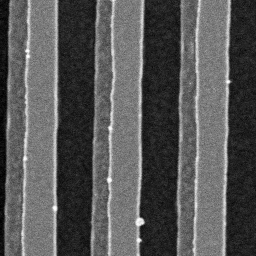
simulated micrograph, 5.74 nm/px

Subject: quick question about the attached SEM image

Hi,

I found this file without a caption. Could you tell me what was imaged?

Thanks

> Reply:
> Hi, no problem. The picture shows lines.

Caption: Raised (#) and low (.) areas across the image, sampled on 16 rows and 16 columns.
.###..###..###..
.###..###..###..
.###..###..###..
.###..###..###..
####..###..###..
####..###..###..
####..###..###..
####..###..###..
####..###..###..
###...###..###..
###...###..###..
###...###..###..
####..###..###..
####..###..###..
###...###..###..
###...###..###..